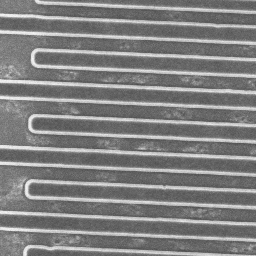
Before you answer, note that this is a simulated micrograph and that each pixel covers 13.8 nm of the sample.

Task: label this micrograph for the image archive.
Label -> parallel lines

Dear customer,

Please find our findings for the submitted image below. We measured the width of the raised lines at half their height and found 17.2 pixels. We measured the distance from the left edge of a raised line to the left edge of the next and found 452 nanometres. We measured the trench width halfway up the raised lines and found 0.213 microns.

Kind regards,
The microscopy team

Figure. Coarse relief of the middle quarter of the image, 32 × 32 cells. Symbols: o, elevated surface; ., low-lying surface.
oooooooooooooooooooooooooooooooo
............oooooooooooooooooooo
................................
................................
................................
oooooooooo......................
oooooooooooooooooooooooooooooooo
oooooooooooooooooooooooooooooooo
oooooooooooooooooooooooooooooooo
.........ooooooooooooooooooooooo
..............................oo
................................
................................
ooooooo.........................
ooooooooooooooooooooooooooooo...
oooooooooooooooooooooooooooooooo
oooooooooooooooooooooooooooooooo
.....ooooooooooooooooooooooooooo
...........................ooooo
................................
................................
ooo.............................
ooooooooooooooooooooooooo.......
oooooooooooooooooooooooooooooooo
oooooooooooooooooooooooooooooooo
.ooooooooooooooooooooooooooooooo
.......................ooooooooo
................................
................................
................................
ooooooooooooooooooooo...........
oooooooooooooooooooooooooooooooo